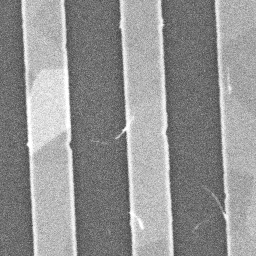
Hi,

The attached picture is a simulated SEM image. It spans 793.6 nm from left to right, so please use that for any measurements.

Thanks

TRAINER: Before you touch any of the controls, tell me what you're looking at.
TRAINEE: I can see one or a few lines or trenches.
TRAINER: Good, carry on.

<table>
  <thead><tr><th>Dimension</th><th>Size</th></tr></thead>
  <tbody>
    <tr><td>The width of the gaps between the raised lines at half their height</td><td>0.177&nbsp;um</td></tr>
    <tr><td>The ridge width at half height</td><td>122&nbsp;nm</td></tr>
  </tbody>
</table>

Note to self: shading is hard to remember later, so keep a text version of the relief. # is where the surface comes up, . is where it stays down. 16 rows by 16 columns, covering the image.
.###....##....##
.###....##....##
..##....##....##
..##....##....##
..##....##....##
..##....##....##
..##....##....##
..##....##....##
..##....##....##
..##....##....##
..##....##....##
..###...###...##
..###...###...##
..###...###...##
..###...###...##
..###...###...##